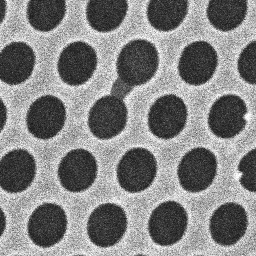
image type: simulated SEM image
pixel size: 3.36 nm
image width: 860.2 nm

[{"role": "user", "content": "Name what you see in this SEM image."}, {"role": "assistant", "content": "a regular array of holes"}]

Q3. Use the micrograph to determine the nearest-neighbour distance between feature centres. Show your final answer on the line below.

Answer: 203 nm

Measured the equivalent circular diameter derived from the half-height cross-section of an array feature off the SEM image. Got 143 nanometres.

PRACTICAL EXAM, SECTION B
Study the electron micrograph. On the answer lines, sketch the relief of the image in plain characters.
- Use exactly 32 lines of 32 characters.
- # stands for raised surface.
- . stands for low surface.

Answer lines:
.##.....###.....##......##.....#
.##.....###.....##......##.....#
###.....###.....##.....###.....#
####...####....####...#####...##
################################
#..######..#####...#####..#####.
....####....###.....###....###..
....###.....###.....##.....###..
....###.....###.....##.....###..
....###....####....###.....###..
#..#####..####....######.######.
##############..################
####....####....###....####...##
.##.....###.....###....###.....#
.##.....###.....###....###.....#
.##.....###.....###....###.....#
####...####....####....####...##
#####.##############.###########
################..######..######
....####....###....####....###..
....###.....###.....##.....###..
....###.....##......##.....###..
....###.....###....###.....###..
....####...####....####...####..
################################
#####..######.######...#####..##
####....####....###....####....#
.###....###.....###....###.....#
.##.....###.....##.....###.....#
####....###....####....###....##
####...#####..######..#####..###
################################